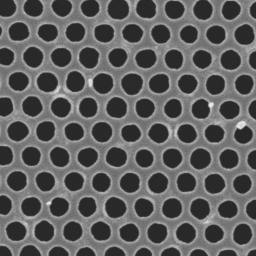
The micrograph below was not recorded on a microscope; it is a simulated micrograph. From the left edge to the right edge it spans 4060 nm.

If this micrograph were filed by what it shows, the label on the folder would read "a regular array of holes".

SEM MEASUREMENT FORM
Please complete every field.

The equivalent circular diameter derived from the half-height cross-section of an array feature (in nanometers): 317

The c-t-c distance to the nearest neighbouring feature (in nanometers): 442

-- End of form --